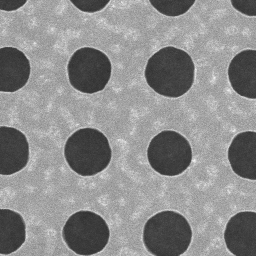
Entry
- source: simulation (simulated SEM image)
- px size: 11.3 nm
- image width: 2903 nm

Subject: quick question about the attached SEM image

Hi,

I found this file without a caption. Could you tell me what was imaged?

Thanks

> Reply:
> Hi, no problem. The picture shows holes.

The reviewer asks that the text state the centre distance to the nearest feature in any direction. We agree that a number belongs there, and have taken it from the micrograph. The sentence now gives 920 nm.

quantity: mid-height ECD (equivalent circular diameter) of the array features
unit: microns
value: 0.526